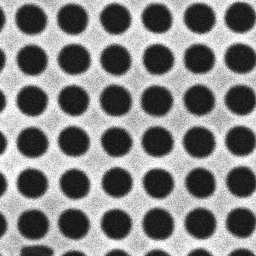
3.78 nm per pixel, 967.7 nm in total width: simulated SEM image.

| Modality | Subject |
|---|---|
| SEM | a regular array of holes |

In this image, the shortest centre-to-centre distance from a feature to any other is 0.154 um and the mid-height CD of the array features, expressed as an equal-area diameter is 120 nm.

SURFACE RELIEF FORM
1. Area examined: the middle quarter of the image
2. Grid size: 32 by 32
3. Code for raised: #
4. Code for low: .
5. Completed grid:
.......##........###.......###..
......####......####.......####.
#....######....#######...#######
################################
################################
#...#######...########..########
.....#####......####......#####.
......###........##........###..
......###........##........###..
.......##........##........###..
......###........##........###..
......####......####.......####.
#....######.....#####.....######
################################
################################
#..#############################
.....######.....#####.....#####.
......####......####.......###..
......###........##........###..
.......##........##.........##..
......###........##........###..
......####.......###.......###..
.....######.....#####.....#####.
################################
################################
################################
#...#######....######.....######
......####......####.......####.
......###........###.......###..
.......##........###........##..
.......##........###........##..
......####.......###.......####.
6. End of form